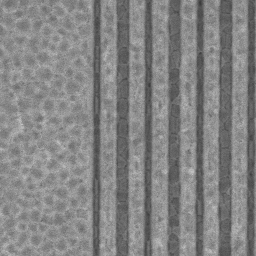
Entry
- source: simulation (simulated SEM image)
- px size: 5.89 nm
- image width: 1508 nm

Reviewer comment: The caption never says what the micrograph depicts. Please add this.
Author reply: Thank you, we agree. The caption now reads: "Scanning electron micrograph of parallel lines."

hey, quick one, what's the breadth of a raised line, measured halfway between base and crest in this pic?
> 73.6 nm